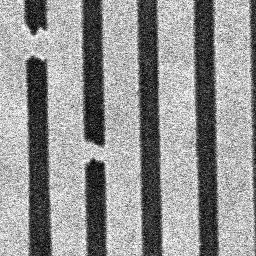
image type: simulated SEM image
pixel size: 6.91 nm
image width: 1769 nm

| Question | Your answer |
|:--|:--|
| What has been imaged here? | parallel lines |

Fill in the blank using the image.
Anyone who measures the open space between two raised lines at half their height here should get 131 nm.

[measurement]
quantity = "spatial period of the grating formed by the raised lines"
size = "55.9 pixels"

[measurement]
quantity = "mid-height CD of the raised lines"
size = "256 nm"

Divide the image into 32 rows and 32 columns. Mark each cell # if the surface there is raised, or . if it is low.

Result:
###...####...####...####...####.
###...####...####...####...####.
###...####...####...####...####.
####.#####...####...####...####.
##########...####...####...####.
##########...####...####...####.
##########...####...####...####.
###..#####...####...####...####.
###...####...####...####...####.
###...####...####...####...####.
###...####...####...####...####.
###...####...####...####...####.
###...####...####...####...####.
###...####...####...####...####.
###...####...####...####...####.
####..####...####...####...####.
####..#####..#####..#####..####.
####..#####..#####..#####..#####
####..############..#####..#####
####..############..#####..#####
####..#####..#####..#####..#####
####..#####..#####..#####..#####
####..#####..#####..#####..#####
####..#####..#####..#####..#####
####..#####..#####..#####..#####
####..#####..#####..#####..#####
####..#####..#####..#####..#####
####..#####..#####..#####..#####
####..#####..#####..#####..#####
####..#####..#####..#####..#####
####..#####..#####..#####..#####
####..#####..#####..#####..#####